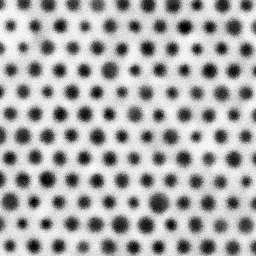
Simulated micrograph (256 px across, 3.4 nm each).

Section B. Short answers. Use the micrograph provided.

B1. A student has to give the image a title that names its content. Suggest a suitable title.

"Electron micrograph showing a regular array of holes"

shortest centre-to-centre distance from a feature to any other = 0.083 micrometres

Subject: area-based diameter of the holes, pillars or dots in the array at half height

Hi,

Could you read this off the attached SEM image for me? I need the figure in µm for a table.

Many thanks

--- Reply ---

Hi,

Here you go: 0.0517